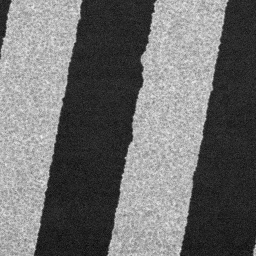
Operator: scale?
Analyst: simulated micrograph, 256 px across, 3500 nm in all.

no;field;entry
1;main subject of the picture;one or a few lines or trenches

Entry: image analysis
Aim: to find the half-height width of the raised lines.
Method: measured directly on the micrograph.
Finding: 0.939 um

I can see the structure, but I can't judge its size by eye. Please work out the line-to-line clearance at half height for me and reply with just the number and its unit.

1010 nanometres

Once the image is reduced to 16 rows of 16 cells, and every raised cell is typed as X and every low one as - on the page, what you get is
-XXXX-----XXXX--
XXXXX----XXXXX--
XXXXX----XXXXX--
XXXX-----XXXXX--
XXXX-----XXXX---
XXXX-----XXXX---
XXXX-----XXXX---
XXXX----XXXXX---
XXX-----XXXXX---
XXX-----XXXX----
XXX-----XXXX----
XXX-----XXXX----
XXX----XXXXX----
XXX----XXXXX----
XX-----XXXX-----
XX-----XXXX-----